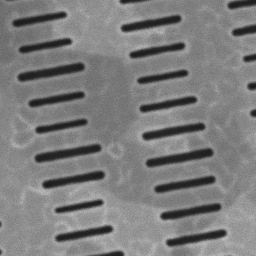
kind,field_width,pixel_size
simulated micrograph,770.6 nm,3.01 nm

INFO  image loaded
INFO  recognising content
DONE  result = a regular array of holes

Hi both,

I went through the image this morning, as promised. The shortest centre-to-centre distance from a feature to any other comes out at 81.7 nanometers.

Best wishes